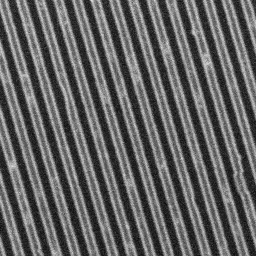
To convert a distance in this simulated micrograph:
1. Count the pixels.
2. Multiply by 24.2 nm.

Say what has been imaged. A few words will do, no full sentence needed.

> parallel lines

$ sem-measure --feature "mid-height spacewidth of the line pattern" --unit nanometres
244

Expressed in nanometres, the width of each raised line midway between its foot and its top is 177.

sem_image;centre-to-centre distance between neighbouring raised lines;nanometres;435